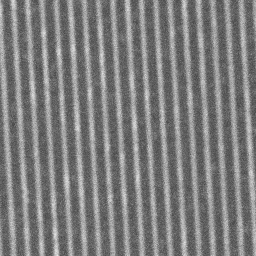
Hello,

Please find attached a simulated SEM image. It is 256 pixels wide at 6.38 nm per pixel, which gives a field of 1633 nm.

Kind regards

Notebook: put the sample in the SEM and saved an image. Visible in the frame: parallel lines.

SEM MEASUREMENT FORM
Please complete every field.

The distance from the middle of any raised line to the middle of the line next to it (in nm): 90.7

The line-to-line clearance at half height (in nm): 62.9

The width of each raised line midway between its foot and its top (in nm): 23.1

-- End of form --